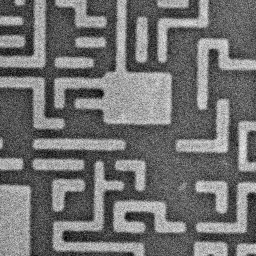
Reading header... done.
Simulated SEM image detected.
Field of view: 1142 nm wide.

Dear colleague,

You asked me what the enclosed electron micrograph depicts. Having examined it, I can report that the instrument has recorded wiring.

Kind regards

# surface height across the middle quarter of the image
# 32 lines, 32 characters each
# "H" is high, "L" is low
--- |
HHHHHHHLLLLLLHHLLLLLLLLLLLLLLLLL
LLLLLLLLLLLLLHHLLLLLLLLLLLLLLLLL
LLLLLLLLLLHHHHHHHHHHHHHHHHLLLLLL
LLLLLLLLLLHHHHHHHHHHHHHHHHLLLLLL
HHHHHHHHHHHHHHHHHHHHHHHHHHLLLLLL
HHHHHHHHHHHHHHHHHHHHHHHHHHLLLLLL
LLLLLLLLLLHHHHHHHHHHHHHHHHLLLLLL
LLLLLLLLLLHHHHHHHHHHHHHHHHLLLLLL
LLLLLLLLLLHHHHHHHHHHHHHHHHLLLLLL
LLLHHHHHHHHHHHHHHHHHHHHHHHLLLLLL
LLLHHHHHHHHHHHHHHHHHHHHHHHLLLLLL
LLLLLLLLLLHHHHHHHHHHHHHHHHLLLLLL
LLLLLLLLLLHHHHHHHHHHHHHHHHLLLLLL
LLLLLLLLLLHHHHHHHHHHHHHHHHLLLLLL
LLLLLLLLLLHHHHHHHHHHHHHHHHLLLLLL
LLLLLLLLLLLLLLLLLLLLLLLLLLLLLLLL
LLLLLLLLLLLLLLLLLLLLLLLLLLLLLLLL
LLLLLLLLLLLLLLLLLLLLLLLLLLLLLLLL
LLLLLLLLLLLLLLLLLLLLLLLLLLLLLLLL
HHHHHHHHHHHHHHHLLLLLLLLLLLLLHHHH
HHHHHHHHHHHHHHHLLLLLLLLLLLLLHHHH
LLLLLLLLLLLLLLLLLLLLLLLLLLLLHHHH
LLLLLLLLLLLLLLLLLLLLLLLLLLLLLLLL
LLLLLLLLLLLLLLLLLLLLLLLLLLLLLLLL
HHHHHLLLLLLLLHHHHHHHLLLLLLLLLLLL
HHHHHLLLHHLLLHHHHHHHLLLLLLLLLLLL
LLLLLLLLHHLLLLLLLHHHLLLLLLLLLLLL
LLLLLLLLHHLLLLLLLLHHLLLLLLLLLLLL
LLLLLLLLHHLLLLLLLLHHLLLLLLLLLLLL
HHHHHLLLHHHHHHLLLLHHLLLLLLLLLLLL
HHHHHLLLHHHHHHHLLLHHLLLLLLLLLLLL
HLLLLLLLHHLLLLLLLLLLLLLLLLLLLLLL